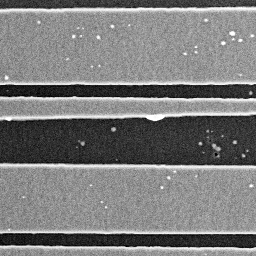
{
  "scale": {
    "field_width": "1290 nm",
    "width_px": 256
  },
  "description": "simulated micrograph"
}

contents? lines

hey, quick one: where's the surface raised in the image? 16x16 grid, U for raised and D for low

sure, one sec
DDDDDDDDDDDDDDUU
UUUUUUUUUUUUUUUU
UUUUUUUUUUUUUUUU
UUUUUUUUUUUUUUUU
UUUUUUUUUUUUUUUU
UUUUUUUUUUUUUUUU
UUUUUUUUUUUUUUUU
DDDDDDDDDDDDDDDD
DDDDDDDDDDDDDDDD
DDDDDDDDDDDDDDDD
UUUUUUUUUUUUUUUU
UUUUUUUUUUUUUUUU
UUUUUUUUUUUUUUUU
UUUUUUUUUUUUUUUU
UUUUUUUUUUUUUUUU
UUUUUUUUUUUUUUUU